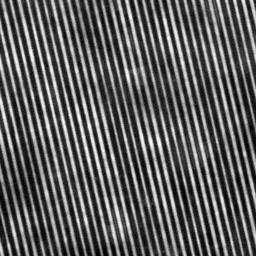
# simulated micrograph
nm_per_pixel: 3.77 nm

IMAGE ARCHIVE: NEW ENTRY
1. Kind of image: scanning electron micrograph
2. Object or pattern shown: parallel lines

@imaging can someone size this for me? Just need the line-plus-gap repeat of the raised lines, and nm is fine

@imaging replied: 30.4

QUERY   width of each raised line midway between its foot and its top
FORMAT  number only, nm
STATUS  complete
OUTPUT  7.8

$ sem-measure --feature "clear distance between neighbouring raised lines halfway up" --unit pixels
5.84